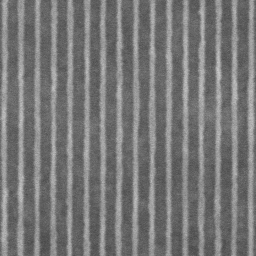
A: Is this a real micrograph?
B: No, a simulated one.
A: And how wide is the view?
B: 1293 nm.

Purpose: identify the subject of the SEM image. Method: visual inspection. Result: parallel lines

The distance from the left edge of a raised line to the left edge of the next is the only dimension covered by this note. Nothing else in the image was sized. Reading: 83.1 nanometres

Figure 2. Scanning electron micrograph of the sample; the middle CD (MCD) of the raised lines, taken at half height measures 0.0202 microns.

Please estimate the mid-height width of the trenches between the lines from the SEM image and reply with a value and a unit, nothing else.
0.0638 micrometres